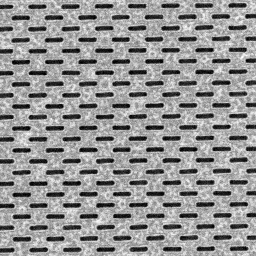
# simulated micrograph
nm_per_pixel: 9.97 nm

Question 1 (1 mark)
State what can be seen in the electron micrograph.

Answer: a regular array of holes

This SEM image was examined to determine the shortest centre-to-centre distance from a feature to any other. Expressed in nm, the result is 196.